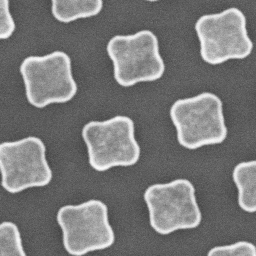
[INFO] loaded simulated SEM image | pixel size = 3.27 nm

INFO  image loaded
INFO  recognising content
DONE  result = raised bodies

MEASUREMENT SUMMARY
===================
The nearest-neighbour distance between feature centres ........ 288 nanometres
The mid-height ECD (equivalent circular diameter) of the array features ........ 171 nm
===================